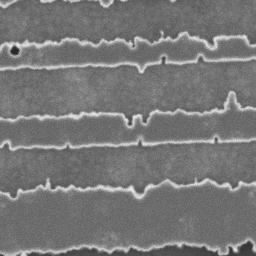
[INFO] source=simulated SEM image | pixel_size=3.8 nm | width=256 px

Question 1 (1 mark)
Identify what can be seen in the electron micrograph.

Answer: one or a few lines or trenches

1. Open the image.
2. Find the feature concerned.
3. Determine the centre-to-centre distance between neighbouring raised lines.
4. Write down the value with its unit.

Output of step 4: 313 nm